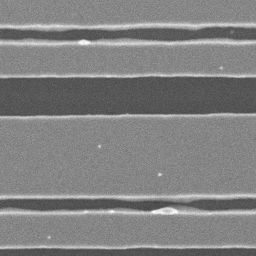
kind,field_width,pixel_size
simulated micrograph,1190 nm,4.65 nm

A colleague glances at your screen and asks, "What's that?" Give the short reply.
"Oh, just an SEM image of lines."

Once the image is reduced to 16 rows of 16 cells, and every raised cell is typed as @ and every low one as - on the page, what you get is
@@@@@@@@@@@@@@@@
@@@@@@@@@@@@@@@@
@@@@@@@@@@@@@@@@
@@@@@@@@@@@@@@@@
@@@@@@@@@@@@@@@@
----------------
----------------
@@@@@@@@@@@@@@@@
@@@@@@@@@@@@@@@@
@@@@@@@@@@@@@@@@
@@@@@@@@@@@@@@@@
@@@@@@@@@@@@@@@@
@@@@@@@@@@@@@@@@
@@@@@@@@@@@@@@@@
@@@@@@@@@@@@@@@@
@-----@@--------